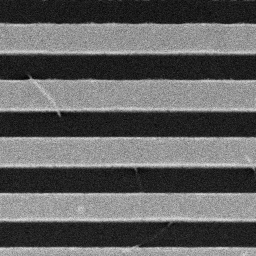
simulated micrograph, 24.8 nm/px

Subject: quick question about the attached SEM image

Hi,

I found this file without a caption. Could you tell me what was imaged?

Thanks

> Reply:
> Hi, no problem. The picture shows lines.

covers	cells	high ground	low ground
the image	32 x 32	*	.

................................
................................
................................
********************************
********************************
********************************
********************************
................................
................................
................................
********************************
********************************
********************************
********************************
................................
................................
................................
********************************
********************************
********************************
********************************
................................
................................
................................
********************************
********************************
********************************
********************************
................................
................................
................................
********************************